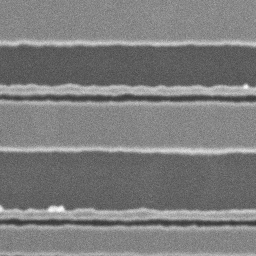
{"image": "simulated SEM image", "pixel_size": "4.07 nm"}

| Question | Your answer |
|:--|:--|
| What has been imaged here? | lines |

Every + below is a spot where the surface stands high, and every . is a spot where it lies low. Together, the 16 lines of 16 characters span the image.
++++++++++++++++
++++++++++++++++
++++++++++++++++
................
................
++++++++++++++++
++++++++++++++++
++++++++++++++++
++++++++++++++++
................
................
................
................
++++++++++++++++
++++++++++++++++
++++++++++++++++